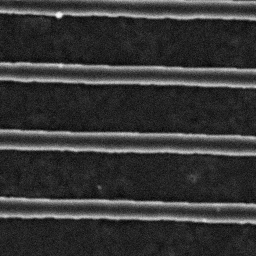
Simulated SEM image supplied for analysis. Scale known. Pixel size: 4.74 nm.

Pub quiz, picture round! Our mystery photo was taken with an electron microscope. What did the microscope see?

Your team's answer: lines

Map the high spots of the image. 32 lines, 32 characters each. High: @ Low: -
@@@@@@@@@@@@@@@@@@@@@@@@@@@@@@@@
@@@@@@@@@@@@@@@@@@@@@@@@@@@@@@@@
--------------------------------
--------------------------------
--------------------------------
--------------------------------
--------------------------------
--------------------------------
@@@@@@@@@@@@@@@@@@@@@@@---------
@@@@@@@@@@@@@@@@@@@@@@@@@@@@@@@@
-----------------@--@@@@@@@@@@@@
--------------------------------
--------------------------------
--------------------------------
--------------------------------
--------------------------------
@@@@@@--------------------------
@@@@@@@@@@@@@@@@@@@@@@@@@@@@@@@@
@@@@@@@@@@@@@@@@@@@@@@@@@@@@@@@@
--------------------------------
--------------------------------
--------------------------------
--------------------------------
--------------------------------
--------------------------------
@@@@@@@@@@@@@@@@@@@@@@@@--------
@@@@@@@@@@@@@@@@@@@@@@@@@@@@@@@@
----------------------@@@@@@@@@@
--------------------------------
--------------------------------
--------------------------------
--------------------------------